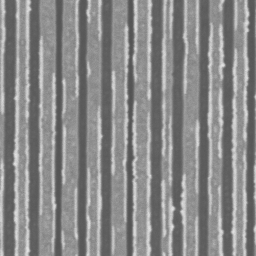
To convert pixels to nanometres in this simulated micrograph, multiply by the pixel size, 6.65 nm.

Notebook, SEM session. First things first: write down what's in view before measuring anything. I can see parallel lines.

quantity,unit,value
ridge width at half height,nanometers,107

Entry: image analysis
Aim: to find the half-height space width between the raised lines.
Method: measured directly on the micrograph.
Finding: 0.0632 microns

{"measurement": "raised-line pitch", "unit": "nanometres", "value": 161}